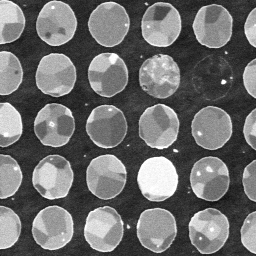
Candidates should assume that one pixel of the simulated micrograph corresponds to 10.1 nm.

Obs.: a regular array of raised bodies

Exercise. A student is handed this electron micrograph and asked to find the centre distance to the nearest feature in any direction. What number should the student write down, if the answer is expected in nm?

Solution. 515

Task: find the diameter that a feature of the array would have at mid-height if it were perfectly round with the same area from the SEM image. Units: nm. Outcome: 425